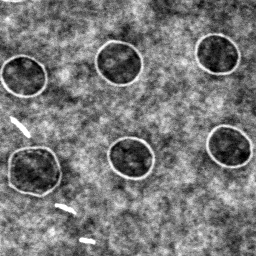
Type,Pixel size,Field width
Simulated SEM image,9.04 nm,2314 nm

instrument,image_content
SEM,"raised bodies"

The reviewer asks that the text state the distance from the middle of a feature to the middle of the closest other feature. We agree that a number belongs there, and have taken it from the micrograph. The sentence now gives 861 nm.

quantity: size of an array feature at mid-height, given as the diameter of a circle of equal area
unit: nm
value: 388